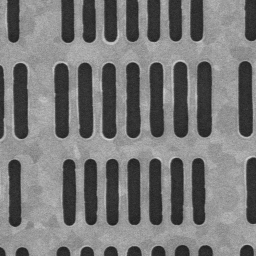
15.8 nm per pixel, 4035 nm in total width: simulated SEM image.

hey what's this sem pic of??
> groups of lines, slits or small figures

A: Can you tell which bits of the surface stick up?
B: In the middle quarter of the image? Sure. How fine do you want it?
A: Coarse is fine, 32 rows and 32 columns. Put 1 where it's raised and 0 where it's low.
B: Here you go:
01110001110001110001100001100001
01100001100001100001100001100001
01100001100001100001100001100001
01100001100001100001100001100001
01100001100001100001100001100001
01100001100001100001100001100001
01100001100001100001100001100001
01100001100001100001100001100001
01100001110001100001100001100001
01100001110001100001100001100001
01100001110001100001100001100001
00100001110001100001100001100001
01100000100001100001100001100001
01100000100001100001100001100001
01110000100001100001100001100001
01110000100001100001100001100001
01110000100001100001100001100001
01110001100001110001110001110001
11111011110001111011111011111011
11111111111111111111111111111111
11111111111111111111111111111111
11111111111111111111111111111111
11111111111111111111111111111111
11111101111111111011110111100111
00011000111001110001100011000011
00011000110000110001100001000011
00011000110000110001100001000011
00011000110000110001100001000011
00011000110000110001100001000011
00011000110000110001100001000011
00011000110000110001100001000011
00011000110000110001100001000011